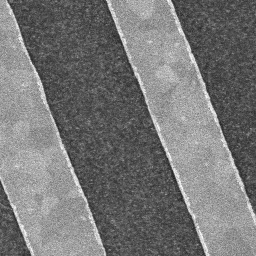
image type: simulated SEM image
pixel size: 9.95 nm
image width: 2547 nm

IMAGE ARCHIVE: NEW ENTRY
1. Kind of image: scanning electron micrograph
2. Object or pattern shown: one or a few lines or trenches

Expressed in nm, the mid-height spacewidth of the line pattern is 922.